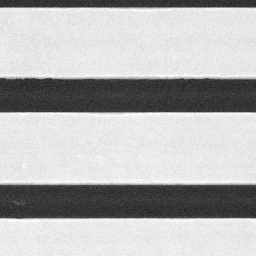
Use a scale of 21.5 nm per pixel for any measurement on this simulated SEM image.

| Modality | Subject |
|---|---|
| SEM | lines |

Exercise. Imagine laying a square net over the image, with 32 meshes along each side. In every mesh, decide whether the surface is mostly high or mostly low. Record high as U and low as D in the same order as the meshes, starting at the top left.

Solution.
DDDDDDDDDDDDDDDDDDDDDDDDDDDDDDDD
UUUUUUUUUUUUUUUUUUUUUUUUUUUUUUUU
UUUUUUUUUUUUUUUUUUUUUUUUUUUUUUUU
UUUUUUUUUUUUUUUUUUUUUUUUUUUUUUUU
UUUUUUUUUUUUUUUUUUUUUUUUUUUUUUUU
UUUUUUUUUUUUUUUUUUUUUUUUUUUUUUUU
UUUUUUUUUUUUUUUUUUUUUUUUUUUUUUUU
UUUUUUUUUUUUUUUUUUUUUUUUUUUUUUUU
UUUUUUUUUUUUUUUUUUUUUUUUUUUUUUUU
UUUUUUUUUUUUUUUUUUUUUUUUUUUUUUUU
DDDDDDDDDDDDDDDDDDDDDDDDDDDDDDDD
DDDDDDDDDDDDDDDDDDDDDDDDDDDDDDDD
DDDDDDDDDDDDDDDDDDDDDDDDDDDDDDDD
DDDDDDDDDDDDDDDDDDDDDDDDDDDDDDDD
UUUUUUUUUUUUUUUUUUUUUUUUUUUUUUUU
UUUUUUUUUUUUUUUUUUUUUUUUUUUUUUUU
UUUUUUUUUUUUUUUUUUUUUUUUUUUUUUUU
UUUUUUUUUUUUUUUUUUUUUUUUUUUUUUUU
UUUUUUUUUUUUUUUUUUUUUUUUUUUUUUUU
UUUUUUUUUUUUUUUUUUUUUUUUUUUUUUUU
UUUUUUUUUUUUUUUUUUUUUUUUUUUUUUUU
UUUUUUUUUUUUUUUUUUUUUUUUUUUUUUUU
UUUUUUUUUUUUUUUUUUUUUUUUUUUUUUUU
DDDDDDDDDDDDDDDDDDDDDDDDDDDDDDDD
DDDDDDDDDDDDDDDDDDDDDDDDDDDDDDDD
DDDDDDDDDDDDDDDDDDDDDDDDDDDDDDDD
DDDDDDDDDDDDDDDDDDDDDDDDDDDDDDDD
UUUUUUUUUUUUUUUUUUUUUUUUUUUUUUUU
UUUUUUUUUUUUUUUUUUUUUUUUUUUUUUUU
UUUUUUUUUUUUUUUUUUUUUUUUUUUUUUUU
UUUUUUUUUUUUUUUUUUUUUUUUUUUUUUUU
UUUUUUUUUUUUUUUUUUUUUUUUUUUUUUUU